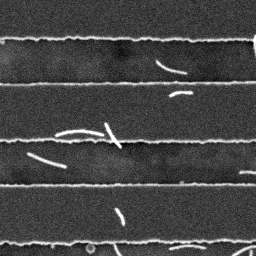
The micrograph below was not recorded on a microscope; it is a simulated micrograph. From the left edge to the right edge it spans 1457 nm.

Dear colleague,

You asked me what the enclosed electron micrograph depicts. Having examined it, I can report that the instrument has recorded lines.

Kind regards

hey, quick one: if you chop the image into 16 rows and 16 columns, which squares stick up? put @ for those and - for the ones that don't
@@@@@@@@@@@@@@@@
@@@@@@@@@@@@@@@@
----------@@@@@@
----------------
----------------
@@@@@@@@@@@@@@@@
@@@@@@@@@@@@@@@@
@@@@@@@@@@@@@@@@
@@@@@@@@@@@@@@@@
----------------
----------------
----------------
@@@@@@@@@@@@@@@@
@@@@@@@@@@@@@@@@
@@@@@@@@@@@@@@@@
----------------